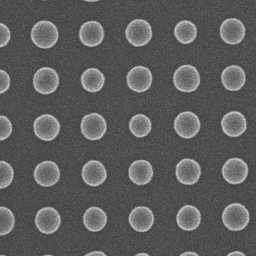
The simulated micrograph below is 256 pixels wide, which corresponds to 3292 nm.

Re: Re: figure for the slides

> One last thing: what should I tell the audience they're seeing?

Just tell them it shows a regular array of raised bodies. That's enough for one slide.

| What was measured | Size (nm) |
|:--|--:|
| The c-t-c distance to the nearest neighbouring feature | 595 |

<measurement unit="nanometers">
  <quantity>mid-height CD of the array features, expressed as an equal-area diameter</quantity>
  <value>323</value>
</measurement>